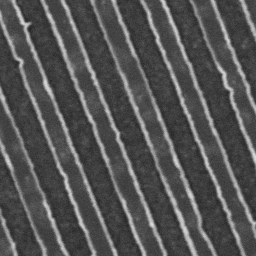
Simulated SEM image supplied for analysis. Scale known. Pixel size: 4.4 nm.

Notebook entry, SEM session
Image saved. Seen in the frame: parallel lines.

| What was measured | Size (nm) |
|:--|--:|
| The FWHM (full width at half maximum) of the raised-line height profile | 95.5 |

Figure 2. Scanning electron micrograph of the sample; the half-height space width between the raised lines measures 108 nm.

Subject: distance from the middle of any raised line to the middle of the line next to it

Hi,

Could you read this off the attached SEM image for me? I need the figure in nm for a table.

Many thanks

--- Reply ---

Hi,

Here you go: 203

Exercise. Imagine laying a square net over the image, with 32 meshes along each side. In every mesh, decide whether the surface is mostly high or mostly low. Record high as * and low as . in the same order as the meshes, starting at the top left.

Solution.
**...***....**....***...***...**
***...***...***...***...***....*
***...***...***....***...***...*
***....**....***...***...***...*
.***...***...***...***....**....
.***...***....**....***...***...
..**....***...***...***...***...
..***...***...***....**....***..
...**....**....***...***...***..
...***...***...***...***....***.
...***...***....**....***...***.
....**....***...***...***....**.
*...***...***...***....**....***
*...***....**....***...***...***
*....***...***...***...***....**
**...***...***....**....***...**
**....**....***...***...***...**
***...***...***...***....**....*
***...***....**....***...***...*
.**....***...***...***...***....
.***...***...***....**....***...
.***....**....***...***...***...
..***...***...***...***....**...
..***...***...***....***...***..
...**....***...***...***...***..
...***...***...***....**....***.
...***...***....***...***...***.
....***...***...***...***....***
*...***...***...***....**....***
*....**....***...***...***...***
**...***...***...***....**....**
**...***...****...***...***...**